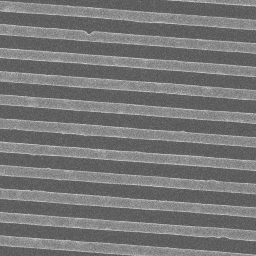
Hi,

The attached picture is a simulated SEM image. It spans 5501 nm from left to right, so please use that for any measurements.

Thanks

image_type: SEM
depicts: parallel lines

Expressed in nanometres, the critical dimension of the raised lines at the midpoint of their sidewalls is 217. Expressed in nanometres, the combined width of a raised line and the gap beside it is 503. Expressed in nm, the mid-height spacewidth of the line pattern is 289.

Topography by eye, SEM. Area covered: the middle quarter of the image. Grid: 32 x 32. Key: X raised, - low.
-------------XXXXXXXXXXXXXXXXXXX
---------------------------XXXXX
--------------------------------
XXXXXX--------------------------
XXXXXXXXXXXXXXXXXXXXX-----------
-XXXXXXXXXXXXXXXXXXXXXXXXXXXXXXX
---------------XXXXXXXXXXXXXXXXX
----------------------------XXXX
--------------------------------
XXXXXXX-------------------------
XXXXXXXXXXXXXXXXXXXX------------
--XXXXXXXXXXXXXXXXXXXXXXXXXXXXXX
-----------------XXXXXXXXXXXXXXX
-------------------------------X
--------------------------------
XXXXXXXXX-----------------------
XXXXXXXXXXXX-XXXXXXXXX----------
---XXXXXXXXX--XXXXXXXXXXXXXXXXXX
-----------------XXXXXXXXXXXXXXX
--------------------------------
--------------------------------
XXXXXXXXXX----------------------
XXXXXXXXXXXXXXXXXXXXXXXX--------
-------XXXXXXXXXXXXXXXXXXXXXXXXX
--------------------XXXXXXXXXXXX
--------------------------------
--------------------------------
XXXXXXXXXXXXX-------------------
XXXXXXXXXXXXXXXXXXXXXXXXXX------
--------XXXXXXXXXXXXXXXXXXXXXXXX
----------------------XXXXXXXXXX
--------------------------------